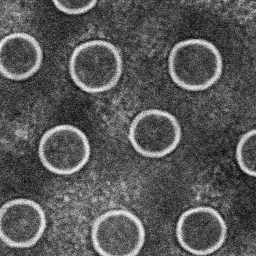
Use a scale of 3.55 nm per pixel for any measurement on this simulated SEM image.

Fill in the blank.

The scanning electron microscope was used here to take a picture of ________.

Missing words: raised bodies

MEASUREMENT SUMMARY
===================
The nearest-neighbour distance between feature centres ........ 316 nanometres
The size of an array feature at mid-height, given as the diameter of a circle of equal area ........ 165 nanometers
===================